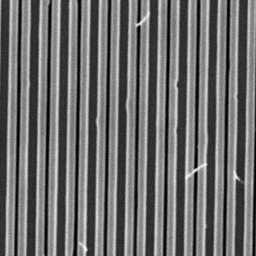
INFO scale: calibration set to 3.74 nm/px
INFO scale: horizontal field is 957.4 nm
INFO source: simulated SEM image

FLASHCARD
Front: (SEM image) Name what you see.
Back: parallel lines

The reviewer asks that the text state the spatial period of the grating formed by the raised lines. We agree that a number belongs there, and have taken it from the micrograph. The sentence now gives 55.5 nm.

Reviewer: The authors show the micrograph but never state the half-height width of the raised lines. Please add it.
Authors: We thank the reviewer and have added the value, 32.7 nm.